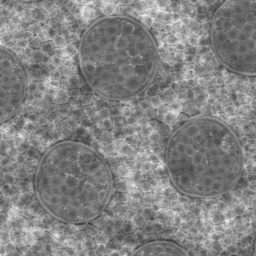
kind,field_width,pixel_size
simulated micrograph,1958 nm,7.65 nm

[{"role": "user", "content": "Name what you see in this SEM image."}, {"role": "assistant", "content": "raised bodies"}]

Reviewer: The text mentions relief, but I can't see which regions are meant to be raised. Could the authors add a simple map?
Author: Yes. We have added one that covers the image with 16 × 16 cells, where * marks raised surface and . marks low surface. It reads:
..............**
......***....***
.....*****...***
*....*****....**
*....*****.....*
**....***.......
*...............
............**..
...........****.
...***....*****.
..*****...*****.
..*****....****.
...****.........
...***..........
................
.........**.....